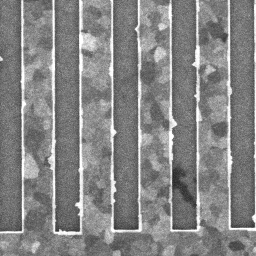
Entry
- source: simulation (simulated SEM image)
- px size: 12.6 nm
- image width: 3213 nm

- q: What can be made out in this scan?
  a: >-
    parallel lines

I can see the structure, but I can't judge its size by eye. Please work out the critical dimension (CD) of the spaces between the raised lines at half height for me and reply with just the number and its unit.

0.329 microns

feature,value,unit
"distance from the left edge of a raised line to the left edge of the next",58.3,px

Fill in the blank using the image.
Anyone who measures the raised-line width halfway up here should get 405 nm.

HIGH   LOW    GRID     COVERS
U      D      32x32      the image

DDDUUUUDDDUUUUDDDUUUUDDDDUUUUDDD
DDDUUUUDDDUUUUDDDUUUUDDDDUUUUDDD
DDDUUUUDDDUUUUDDDUUUUDDDDUUUUDDD
DDDUUUUDDDUUUUDDDUUUUDDDDUUUUDDD
DDDUUUUDDDUUUUDDDUUUUDDDDUUUUDDD
DDDUUUUDDDUUUUDDDUUUUDDDDUUUUDDD
DDDUUUUDDDUUUUDDDUUUUDDDUUUUUDDD
DDDUUUUDDDUUUUDDDUUUUDDDUUUUUDDD
DDDUUUUDDDUUUUDDDUUUUDDDUUUUUDDD
DDDUUUUDDDUUUUDDDUUUUDDDDUUUUDDD
DDDUUUUDDDUUUUDDDUUUUDDDDUUUUDDD
DDDUUUUDDDUUUUDDDUUUUDDDDUUUUDDD
DDDUUUUDDDUUUUDDDUUUUDDDDUUUUDDD
DDDUUUUDDDUUUUDDDUUUUDDDDUUUUDDD
DDDUUUUDDDUUUUDDDUUUUUDDDUUUUDDD
DDDUUUUDDDUUUUDDDUUUUUDDDUUUUDDD
DDDUUUUDDDUUUUDDDUUUUDDDDUUUUDDD
DDDUUUUDDDUUUUDDDUUUUUDDDUUUUDDD
DDDUUUUDDDUUUUDDDUUUUUDDDUUUUDDD
DDDUUUUDDDUUUUDDDUUUUUDDDUUUUDDD
DDDUUUUDDDUUUUDDDUUUUDDDDUUUUDDD
DDDUUUUDDDUUUUDDDUUUUDDDDUUUUDDD
DDDUUUUDDDUUUUDDDUUUUDDDDUUUUDDD
DDDUUUUDDDUUUUDDDUUUUDDDDUUUUDDD
DDDUUUUDDDUUUUDDDUUUUDDDDUUUUDDD
DDDUUUUDDDUUUUDDDUUUUDDDDUUUUDDD
DDDUUUUDDDUUUUDDDUUUUDDDDUUUUDDD
DDDUUUUDDDUUUUDDDUUUUDDDDUUUUDDD
DDDUUUUDDDUUUUDDDUUUUUDDDUUUUDDU
UUUUUUUUUUUUUUUUUUUUUUUUUUUUUUUU
UUUUUUUUUUUUUUUUUUUUUUUUUUUUUUUU
UUUUUUUUUUUUUUUUUUUUUUUUUUUUUUUU